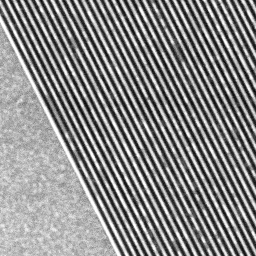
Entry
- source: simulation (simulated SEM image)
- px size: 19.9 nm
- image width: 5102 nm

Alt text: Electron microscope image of parallel lines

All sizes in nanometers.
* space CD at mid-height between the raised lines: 91.2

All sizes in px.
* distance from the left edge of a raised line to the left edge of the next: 6.82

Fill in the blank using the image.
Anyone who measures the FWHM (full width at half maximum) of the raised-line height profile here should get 37.8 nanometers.